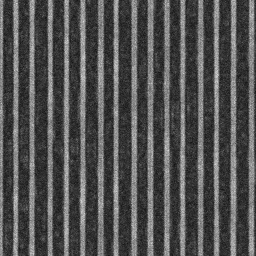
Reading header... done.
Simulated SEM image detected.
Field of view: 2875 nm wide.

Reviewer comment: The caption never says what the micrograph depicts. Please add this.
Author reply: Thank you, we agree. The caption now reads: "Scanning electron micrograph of parallel lines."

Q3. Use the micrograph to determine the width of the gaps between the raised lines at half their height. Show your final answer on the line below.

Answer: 138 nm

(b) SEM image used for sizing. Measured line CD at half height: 46.3 nanometers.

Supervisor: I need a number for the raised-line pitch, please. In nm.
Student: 189